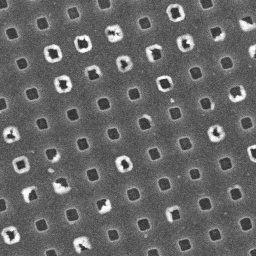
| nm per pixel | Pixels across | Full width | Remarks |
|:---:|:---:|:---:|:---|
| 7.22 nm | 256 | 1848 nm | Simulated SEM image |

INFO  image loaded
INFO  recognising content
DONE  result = a regular array of holes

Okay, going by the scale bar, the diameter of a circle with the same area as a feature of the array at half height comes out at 85.8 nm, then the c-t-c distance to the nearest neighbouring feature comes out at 227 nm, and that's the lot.